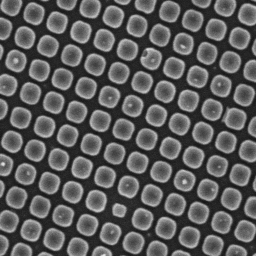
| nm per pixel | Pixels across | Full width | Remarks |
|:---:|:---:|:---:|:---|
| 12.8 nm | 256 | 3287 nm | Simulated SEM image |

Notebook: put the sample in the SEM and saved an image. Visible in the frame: a regular array of raised bodies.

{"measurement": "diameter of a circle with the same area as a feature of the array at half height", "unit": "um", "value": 0.268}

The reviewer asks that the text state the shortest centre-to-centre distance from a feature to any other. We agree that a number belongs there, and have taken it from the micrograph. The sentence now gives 319 nanometres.